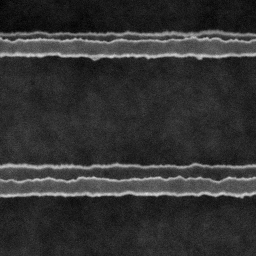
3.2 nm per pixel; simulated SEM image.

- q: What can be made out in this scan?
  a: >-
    lines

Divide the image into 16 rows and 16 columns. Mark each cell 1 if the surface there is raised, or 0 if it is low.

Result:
0000000000000000
0000000000000000
1111111111111111
1110111111111111
0000000000000000
0000000000000000
0000000000000000
0000000000000000
0000000000000000
0000000000000000
1111111111111111
1111111111111111
0000000000000000
0000000000000000
0000000000000000
0000000000000000